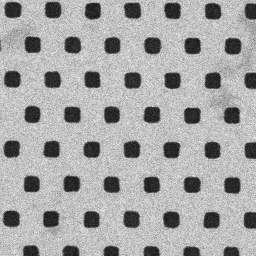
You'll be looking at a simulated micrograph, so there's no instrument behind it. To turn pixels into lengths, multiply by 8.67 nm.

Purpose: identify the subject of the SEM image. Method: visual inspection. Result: a regular array of holes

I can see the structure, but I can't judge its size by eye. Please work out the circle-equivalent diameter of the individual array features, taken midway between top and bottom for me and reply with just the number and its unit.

152 nanometers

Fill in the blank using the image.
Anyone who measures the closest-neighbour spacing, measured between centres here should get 344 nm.